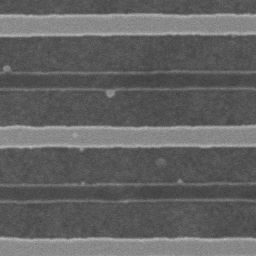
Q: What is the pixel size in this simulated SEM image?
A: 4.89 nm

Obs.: lines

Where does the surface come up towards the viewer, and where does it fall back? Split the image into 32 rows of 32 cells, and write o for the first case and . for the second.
................................
................................
oooooooooooooooooooooooooooooooo
oooooooooooooooooooooooooooooooo
oooo.o..........................
................................
................................
................................
................................
oooooooooooooooooooooooooooooooo
oooooooooooooooooooooooooooooooo
.............o..................
................................
................................
................................
................................
oooooooooooooooooooooooooooooooo
oooooooooooooooooooooooooooooooo
..........o.....................
................................
................................
................................
................................
oooooooooooooooooooooooooooooooo
oooooooooooooooooooooooooooooooo
................................
................................
................................
................................
................................
oooooooooooooooooooooooooooooooo
oooooooooooooooooooooooooooooooo